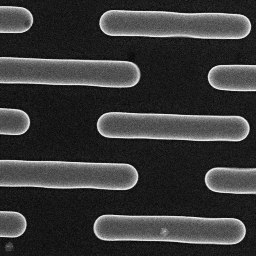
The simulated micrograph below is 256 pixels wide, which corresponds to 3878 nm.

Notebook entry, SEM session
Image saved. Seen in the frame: groups of lines, slits or small figures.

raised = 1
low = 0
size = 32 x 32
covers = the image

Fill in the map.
00000000000000000000000000000000
11110000000001111111100000000000
11110000000001111111111111111110
11110000000001111111111111111110
00000000000000000011110111111110
00000000000000000000000000000000
00000000000000000000000000000000
11111111100000000000000000000000
11111111111111111000000000011111
11111111111111111000000000111111
00000111111111111000000000111111
00000000000000000000000000000000
00000000000000000000000000000000
00000000000000000000000000000000
11100000000001111111111000000000
11110000000011111111111111111110
11100000000011111111111111111110
00000000000000000000000011101100
00000000000000000000000000000000
00000000000000000000000000000000
11111111111111110000000000000000
11111111111111111000000000111111
11111111111111111000000000111111
00000000000111110000000000111111
00000000000000000000000000000000
00000000000000000000000000000000
11000000000000000000000000000000
11100000000011111111111111111100
11100000000011111111111111111110
11000000000011111111111111111100
00000000000000000000000000000000
00000000000000000000000000000000